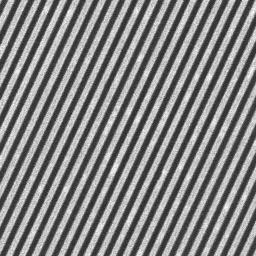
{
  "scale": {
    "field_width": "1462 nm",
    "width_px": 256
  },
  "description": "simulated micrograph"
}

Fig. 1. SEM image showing parallel lines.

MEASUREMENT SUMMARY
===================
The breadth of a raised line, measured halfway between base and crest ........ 0.0363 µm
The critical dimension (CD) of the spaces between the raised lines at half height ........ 31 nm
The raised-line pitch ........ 0.0672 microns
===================